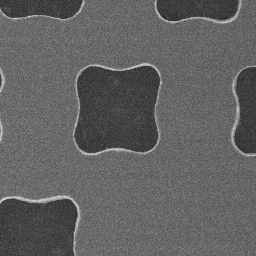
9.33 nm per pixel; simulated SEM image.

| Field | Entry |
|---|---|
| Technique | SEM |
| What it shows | holes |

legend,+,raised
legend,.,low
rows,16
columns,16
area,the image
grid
.....+++++.....+
++++++++++++++++
++++++++++++++++
++++++++++++++++
+++++.....+++++.
+++++.....+++++.
+++++.....+++++.
+++++.....+++++.
+++++.....+++++.
+++++.+++++++++.
++++++++++++++++
++++++++++++++++
.++.++++++++++++
.....+++++++++++
.....+++++++++++
.....+++++++++++